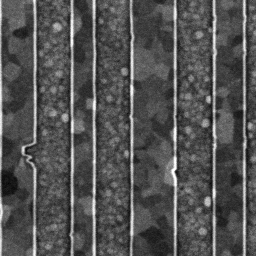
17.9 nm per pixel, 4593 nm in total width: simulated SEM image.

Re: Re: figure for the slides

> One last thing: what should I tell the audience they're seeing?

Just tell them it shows one or a few lines or trenches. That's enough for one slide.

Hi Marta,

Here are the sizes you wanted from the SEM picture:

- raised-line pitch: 71.8 px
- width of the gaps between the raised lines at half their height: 0.684 micrometres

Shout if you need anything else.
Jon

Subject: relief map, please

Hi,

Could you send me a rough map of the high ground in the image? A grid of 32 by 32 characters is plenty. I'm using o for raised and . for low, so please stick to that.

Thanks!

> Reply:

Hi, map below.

oooo.....ooo....oooooo.....ooo..
oooo.....ooo....oooooo.....ooo..
oooo.....ooo....oooooo.....oooo.
oooo.....ooo....oooooo.....ooo..
oooo.....ooo.....ooooo.....ooo..
oooo.....ooo.....ooooo.....ooo..
oooo.....ooo.....ooooo.....oooo.
oooo.....ooo.....ooooo.....ooo..
oooo.....ooo.....ooooo.....ooo..
oooo.....ooo.....ooooo.....ooo..
oooo.....ooo....oooooo.....ooo..
oooo.....ooo....oooooo.....ooo..
oooo.....ooo....oooooo.....ooo..
oooo.....ooo....oooooo.....ooo..
oooo.....ooo....oooooo.....ooo..
oooo.....ooo....oooooo.....ooo..
oooo.....ooo....oooooo.....ooo..
oooo.....ooo....oooooo.....oooo.
ooo......ooo....oooooo.....oooo.
ooo......ooo....oooooo.....ooo..
oooo.....ooo....oooooo.....ooo..
oooo.....ooo.....ooooo.....ooo..
oooo.....ooo.....ooooo.....ooo..
oooo.....ooo.....ooooo.....ooo..
oooo.....ooo.....ooooo.....ooo..
oooo.....ooo.....ooooo.....ooo..
oooo.....ooo.....ooooo.....ooo..
oooo.....ooo.....ooooo.....ooo..
oooo.....ooo....oooooo.....ooo..
oooo.....ooo....oooooo.....ooo..
oooo.....ooo....oooooo.....ooo..
oooo.....ooo....oooooo.....ooo..